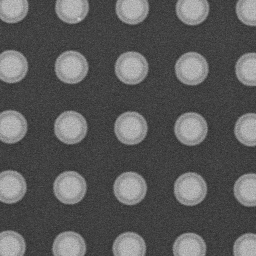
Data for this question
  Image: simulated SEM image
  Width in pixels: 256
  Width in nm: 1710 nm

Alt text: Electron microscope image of an array of small figures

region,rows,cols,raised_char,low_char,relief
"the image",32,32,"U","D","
UUUDDDDUUUUDDDDUUUUDDDUUUUDDDDUU
UUUDDDDUUUUDDDDUUUDDDDUUUUDDDDUU
UUUDDDDDUUDDDDDUUUDDDDDUUUDDDDUU
DDDDDDDDDDDDDDDDDDDDDDDDDDDDDDDD
DDDDDDDDDDDDDDDDDDDDDDDDDDDDDDDD
DDDDDDDDDDDDDDDDDDDDDDDDDDDDDDDD
DUDDDDDDUUDDDDDDDDDDDDDDDDDDDDDD
UUUDDDDUUUUDDDDUUUDDDDUUUUDDDDUU
UUUDDDDUUUUDDDUUUUDDDDUUUUDDDUUU
UUUDDDDUUUUDDDDUUUDDDDUUUUDDDDUU
DDDDDDDDDDDDDDDDUDDDDDDUUDDDDDDU
DDDDDDDDDDDDDDDDDDDDDDDDDDDDDDDD
DDDDDDDDDDDDDDDDDDDDDDDDDDDDDDDD
DDDDDDDDDDDDDDDDDDDDDDDDDDDDDDDD
UUUDDDDUUUDDDDDUUUDDDDDUUDDDDDUU
UUUDDDDUUUUDDDUUUUDDDDUUUUDDDUUU
UUUDDDDUUUUDDDUUUUDDDDUUUUDDDUUU
UUDDDDDDUUDDDDDUUUDDDDUUUDDDDDUU
DDDDDDDDDDDDDDDDDDDDDDDDDDDDDDDD
DDDDDDDDDDDDDDDDDDDDDDDDDDDDDDDD
DDDDDDDDDDDDDDDDDDDDDDDDDDDDDDDD
UUDDDDDDUDDDDDDDDDDDDDDDDDDDDDDD
UUUDDDDUUUUDDDUUUUDDDDUUUDDDDDUU
UUUDDDDUUUUDDDUUUUDDDDUUUUDDDUUU
UUUDDDDUUUDDDDUUUUDDDDUUUUDDDUUU
DDDDDDDDDDDDDDDDUDDDDDDUUDDDDDUU
DDDDDDDDDDDDDDDDDDDDDDDDDDDDDDDD
DDDDDDDDDDDDDDDDDDDDDDDDDDDDDDDD
DDDDDDDDDDDDDDDDDDDDDDDDDDDDDDDD
UUUDDDDUUUDDDDDUUDDDDDDUUDDDDDUU
UUUDDDDUUUUDDDUUUUDDDDUUUUDDDUUU
UUUDDDDUUUUDDDUUUUDDDDUUUUDDDUUU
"